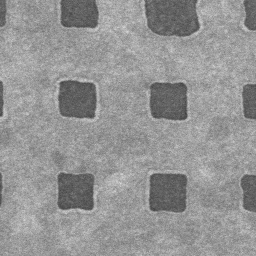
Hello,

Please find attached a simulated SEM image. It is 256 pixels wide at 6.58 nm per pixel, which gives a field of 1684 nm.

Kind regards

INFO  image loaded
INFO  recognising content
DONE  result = holes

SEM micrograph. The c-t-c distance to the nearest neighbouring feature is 601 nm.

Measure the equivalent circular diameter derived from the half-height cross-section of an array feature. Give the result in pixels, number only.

42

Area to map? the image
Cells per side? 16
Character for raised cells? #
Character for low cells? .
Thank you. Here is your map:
####..###...###.
####..###...###.
################
################
################
####..###...###.
####..###...###.
##########.#####
################
################
################
####..###...###.
####..###...###.
################
################
################